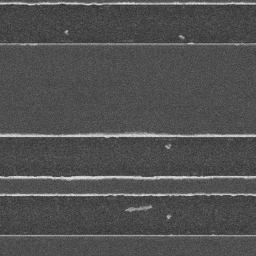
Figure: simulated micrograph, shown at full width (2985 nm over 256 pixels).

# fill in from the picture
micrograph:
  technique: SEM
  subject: lines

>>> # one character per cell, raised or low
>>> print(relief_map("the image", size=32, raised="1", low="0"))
00011000001110000000000000000000
00000000000000000000000000000000
00000000000000000000000000000000
00000000000000000000000000000000
00000000000000000000000000000000
00000000000000000000000110000000
11111111111111111111111111111111
11111111111111111111111111111111
11111111111111111111111111111111
11111111111111111111111111111111
11111111111111111111111111111111
11111111111111111111111111111111
11111111111111111111111111111111
11111111111111111111111111111111
11111111111111111111111111111111
11111111111111111111111111111111
11111111111111111111111111111111
00000000000000000000000000000000
00000000000000000000000000000000
00000000000000000000000000000000
00000000000000000000000000000000
00000000000000000000000000000000
11111111111111111111111111111111
11111111111111111111111111111111
00000000000000000000000000000000
00000000000000000000000000000000
00000000000000000000000000000000
00000000000000000000000000000000
00000000000000000000000000000000
11111111111111111111111111111111
11111111111111111111111111111111
11111111111111111111111111111111